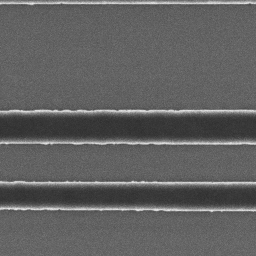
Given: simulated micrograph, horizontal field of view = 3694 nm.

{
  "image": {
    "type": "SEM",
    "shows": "lines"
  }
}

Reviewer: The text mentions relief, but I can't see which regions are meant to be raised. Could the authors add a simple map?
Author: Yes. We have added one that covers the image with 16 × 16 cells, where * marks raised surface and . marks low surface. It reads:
................
................
................
................
................
................
................
****************
****************
................
................
****************
****************
................
................
................